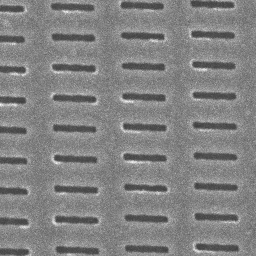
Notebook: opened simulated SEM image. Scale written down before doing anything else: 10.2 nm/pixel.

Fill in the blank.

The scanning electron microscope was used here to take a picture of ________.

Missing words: a regular array of holes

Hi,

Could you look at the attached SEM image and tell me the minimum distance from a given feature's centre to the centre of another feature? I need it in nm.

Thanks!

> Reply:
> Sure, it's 311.